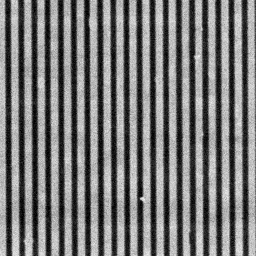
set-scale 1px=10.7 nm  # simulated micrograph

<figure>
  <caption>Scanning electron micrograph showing parallel lines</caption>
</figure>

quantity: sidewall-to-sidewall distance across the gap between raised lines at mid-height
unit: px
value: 5.99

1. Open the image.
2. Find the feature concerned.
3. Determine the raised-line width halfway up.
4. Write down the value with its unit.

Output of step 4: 73.3 nm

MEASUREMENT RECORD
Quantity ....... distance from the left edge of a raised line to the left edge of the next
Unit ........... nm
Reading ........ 140